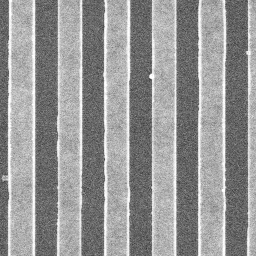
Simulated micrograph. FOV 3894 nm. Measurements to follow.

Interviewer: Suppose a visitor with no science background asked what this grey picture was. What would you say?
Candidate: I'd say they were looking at lines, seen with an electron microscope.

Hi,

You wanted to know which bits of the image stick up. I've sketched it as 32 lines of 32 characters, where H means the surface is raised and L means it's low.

LHHHLLLHHHLLLHHHLLLHHHLLLHHHLLLH
LHHHLLLHHHLLLHHHLLLHHHLLLHHHLLLH
LHHHLLLHHHLLLHHHLLLHHHLLLHHHLLLH
LHHHLLLHHHLLLHHHLLLHHHLLLHHHLLLH
LHHHLLLHHHLLLHHHLLLHHHLLLHHHLLLH
LHHHLLLHHHLLLHHHLLLHHHLLLHHHLLLH
LHHHLLLHHHLLLHHHLLLHHHLLLHHHLLLH
LHHHLLLHHHLLLHHHLLLHHHLLLHHHLLLH
LHHHLLLHHHLLLHHHLLLHHHLLLHHHLLLH
LHHHLLLHHHLLLHHHLLLHHHLLLHHHLLLH
LHHHLLLHHHLLLHHHLLLHHHLLLHHHLLLH
LHHHLLLHHHLLLHHHLLLHHHLLLHHHLLLH
LHHHLLLHHHLLLHHHLLLHHHLLLHHHLLLH
LHHHLLLHHHLLLHHHLLLHHHLLLHHHLLLH
LHHHLLLHHHLLLHHHLLLHHHLLLHHHLLLH
LHHHLLLHHHLLLHHHLLLHHHLLLHHHLLLH
LHHHLLLHHHLLLHHHLLLHHHLLLHHHLLLH
LHHHLLLHHHLLLHHHLLLHHHLLLHHHLLLH
LHHHLLLHHHLLLHHHLLLHHHLLLHHHLLLH
LHHHLLLHHHLLLHHHLLLHHHLLLHHHLLLH
LHHHLLLHHHLLLHHHLLLHHHLLLHHHLLLH
LHHHLLLHHHLLLHHHLLLHHHLLLHHHLLLH
LHHHLLLHHHLLLHHHLLLHHHLLLHHHLLLH
LHHHLLLHHHLLLHHHLLLHHHLLLHHHLLLH
LHHHLLLHHHLLLHHHLLLHHHLLLHHHLLLH
LHHHLLLHHHLLLHHHLLLHHHLLLHHHLLLH
LHHHLLLHHHLLLHHHLLLHHHLLLHHHLLLH
LHHHLLLHHHLLLHHHLLLHHHLLLHHHLLLH
LHHHLLLHHHLLLHHHLLLHHHLLLHHHLLLH
LHHHLLLHHHLLLHHHLLLHHHLLLHHHLLLH
LHHHLLLHHHLLLHHHLLLHHHLLLHHHLLLH
LHHHLLLHHHLLLHHHLLLHHHLLLHHHLLLH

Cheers